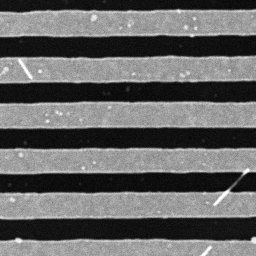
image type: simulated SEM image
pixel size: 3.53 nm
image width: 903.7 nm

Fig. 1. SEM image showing lines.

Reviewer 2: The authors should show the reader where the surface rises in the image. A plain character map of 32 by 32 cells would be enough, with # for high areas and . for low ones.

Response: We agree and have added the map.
................................
....############################
################################
################################
###...########.........##.......
................................
................................
################################
################################
################################
................................
................................
................................
################################
################################
################################
................................
................................
................................
################################
################################
##################...###......#.
................................
................................
################################
################################
################################
................................
................................
................................
################################
################################